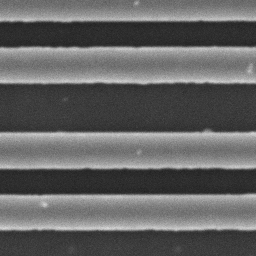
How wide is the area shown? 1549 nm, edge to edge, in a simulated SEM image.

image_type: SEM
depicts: lines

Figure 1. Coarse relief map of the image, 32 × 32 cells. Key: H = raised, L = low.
HHHHHHHHHHHHHHHHHHHHHHHHHHHHHHHH
HHHHHHHHHHHHHHHHHHHHHHHHHHHHHHHH
HHHHHHHHHHHHHHHHHHHHHHHHHHHHHHHH
LLLLLLLLLLLLLLLLLLLLLLLLLLLLLLLL
LLLLLLLLLLLLLLLLLLLLLLLLLLLLLLLL
LLLLLLLLLLLLLLLLLLLLLLLLLLLLLLLL
HHHHHHHHHHHHHHHHHHHHHHHHHHHHHHHH
HHHHHHHHHHHHHHHHHHHHHHHHHHHHHHHH
HHHHHHHHHHHHHHHHHHHHHHHHHHHHHHHH
HHHHHHHHHHHHHHHHHHHHHHHHHHHHHHHH
LLLLLLLLLLLLLLLLLLLLLLLLLLLLLLLL
LLLLLLLLLLLLLLLLLLLLLLLLLLLLLLLL
LLLLLLLLLLLLLLLLLLLLLLLLLLLLLLLL
LLLLLLLLLLLLLLLLLLLLLLLLLLLLLLLL
LLLLLLLLLLLLLLLLLLLLLLLLLLLLLLLL
LLLLLLLLLLLLLLLLLLLLLLLLLLLLLLLL
LLLLLLLLLLLLLLLLLLLLLLLLLLLLLLLL
HHHHHHHHHHHHHHHHHHHHHHHHHHHHHHHH
HHHHHHHHHHHHHHHHHHHHHHHHHHHHHHHH
HHHHHHHHHHHHHHHHHHHHHHHHHHHHHHHH
HHHHHHHHHHHHHHHHHHHHHHHHHHHHHHHH
LLLLLLLLLLLLLLLLLLLLLLLLLLLLLLLL
LLLLLLLLLLLLLLLLLLLLLLLLLLLLLLLL
LLLLLLLLLLLLLLLLLLLLLLLLLLLLLLLL
HHHHHHHHHHHHHHHHHHHHHHHHHHHHHHHH
HHHHHHHHHHHHHHHHHHHHHHHHHHHHHHHH
HHHHHHHHHHHHHHHHHHHHHHHHHHHHHHHH
HHHHHHHHHHHHHHHHHHHHHHHHHHHHHHHH
HHHHHHHHHHHHHHHHHHHHHHHHHHHHHHHH
LLLLLLLLLLLLLLLLLLLLLLLLLLLLLLLL
LLLLLLLLLLLLLLLLLLLLLLLLLLLLLLLL
LLLLLLLLLLLLLLLLLLLLLLLLLLLLLLLL